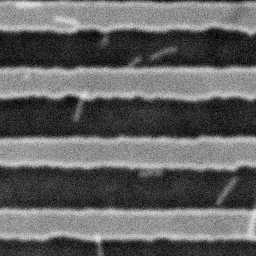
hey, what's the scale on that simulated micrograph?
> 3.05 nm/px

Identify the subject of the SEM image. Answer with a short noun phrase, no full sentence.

lines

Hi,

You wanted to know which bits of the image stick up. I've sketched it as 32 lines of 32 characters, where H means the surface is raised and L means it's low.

HHHHHHHHHHHHHHHHHHHHHHHHHHHHHHHH
HHHHHHHHHHHHHHHHHHHHHHHHHHHHHHHH
HHHHHHHHHHHHHHHHHHHHHHHHHHHHHHHH
HHHHHHHHHHHHHHHHLHHHHHHHHHLLHHHH
LLLLLLLLLLLLLLLLLLLLLLLLLLLLLLLL
LLLLLLLLLLLLLLLLLLLLLLLLLLLLLLLL
LLLLLLLLLLLLLLLLLLLLLLLLLLLLLLLL
LLLLLLLLLLLLLLLLLLLLLLLLLLLLLLLL
LLLLLLLLLLLLLLLLLLLLLLLLLLLLLLLL
HHHHHHHHHHHHHHHHHHHHHHHHHHHHHHHH
HHHHHHHHHHHHHHHHHHHHHHHHHHHHHHHH
HHHHHHHHHHHHHHHHHHHHHHHHHHHHHHHH
LLLLLLLLLLLLLLLLLLLLLLLLLLLLLLLL
LLLLLLLLLLLLLLLLLLLLLLLLLLLLLLLL
LLLLLLLLLLLLLLLLLLLLLLLLLLLLLLLL
LLLLLLLLLLLLLLLLLLLLLLLLLLLLLLLL
LLLLLLLLLLLLLLLLLLLLLLLLLLLLLLLL
LLHHHHLHHHHHHLHHHHHHHHLLHHHHHHHH
HHHHHHHHHHHHHHHHHHHHHHHHHHHHHHHH
HHHHHHHHHHHHHHHHHHHHHHHHHHHHHHHH
HHHHHHHHHHHHHHHHHHHHHHHHHHHHHHHH
LLLLLLLLLLLLLLLLLLLLLLLLLLLLLLLL
LLLLLLLLLLLLLLLLLLLLLLLLLLLLLLLL
LLLLLLLLLLLLLLLLLLLLLLLLLLLLLLLL
LLLLLLLLLLLLLLLLLLLLLLLLLLLLLLLL
LLLLLLLLLLLLLLLLLLLLLLLLLLLLLLLL
HHHHHHHHHHHHHHHHHHHHHHHHHHHHHHHH
HHHHHHHHHHHHHHHHHHHHHHHHHHHHHHHH
HHHHHHHHHHHHHHHHHHHHHHHHHHHHHHHH
HHHHHHHLLHHHHHHHHHHHHHHHHHHHHHHH
LLLLLLLLLLLLLLLLLLLLLLLLLLLLLLLL
LLLLLLLLLLLLLLLLLLLLLLLLLLLLLLLL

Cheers